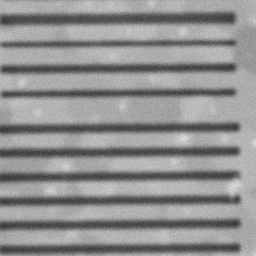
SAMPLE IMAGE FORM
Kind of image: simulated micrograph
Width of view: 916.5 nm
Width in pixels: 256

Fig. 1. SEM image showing groups of lines, slits or small figures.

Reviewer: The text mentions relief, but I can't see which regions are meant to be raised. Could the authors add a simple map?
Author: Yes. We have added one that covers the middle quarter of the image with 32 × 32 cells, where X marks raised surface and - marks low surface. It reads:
--------------------------------
--------------------------------
------XXXXX--XXXXXXXXXXXXXXXXXXX
XXXXXXXXXXXXXXXXXXXXXXXXXXXXXXXX
XXXXXXXXXXXXXXXXXXXXXXXXXXXXXXXX
XXXXXXXXXXXXXXXXXXXXXXXXXXXXXXXX
--------------------------------
--------------------------------
XXXXXXXXXXXXXXXXXXXXXXXXXXXXXXXX
XXXXXXXXXXXXXXXXXXXXXXXXXXXXXXXX
XXXXXXXXXXXXXXXXXXXXXXXXXXXXXXXX
XXXXXXXXXXXXXXXXXXXXXXXXXXXXXXXX
XXXXXXXXXXXXXXXXXXXXXXXXXXXXXXXX
XXXXXXXXXXXXXXXXXXXXXXXXXXXXXXXX
XXXXXXXXXXXXXXXXXXXXXXXXXXX-XXXX
--------------------------------
--------------------------------
----XXXXXXXXXXXXXXXXXXXXXXXXXXXX
XXXXXXXXXXXXXXXXXXXXXXXXXXXXXXXX
XXXXXXXXXXXXXXXXXXXXXXXXXXXXXXXX
XXXXXXXXXXXXXXXXXXXXXXXXXXXXXXXX
--------------------------------
--------------------------------
XXXXXXXXXXXXXXXXXXXXXXXXXXXXXXXX
XXXXXXXXXXXXXXXXXXXXXXXXXXXXXXXX
XXXXXXXXXXXXXXXXXXXXXXXXXXXXXXXX
XXXXXXXXXXXXXXXXXXXXXXXXXXXXXXXX
--------------------------------
--------------------------------
---------------------XXXXXXXXXXX
XXXXXXXXXXXXXXXXXXXXXXXXXXXXXXXX
XXXXXXXXXXXXXXXXXXXXXXXXXXXXXXXX